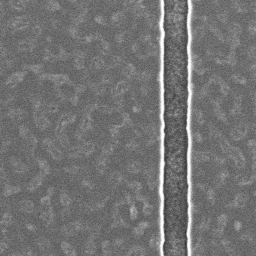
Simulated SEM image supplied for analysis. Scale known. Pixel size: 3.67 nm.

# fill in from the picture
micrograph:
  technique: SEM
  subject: one or a few lines or trenches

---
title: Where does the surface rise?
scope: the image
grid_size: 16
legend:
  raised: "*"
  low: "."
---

**********..****
**********..****
**********..****
**********..****
**********..****
**********..****
**********..****
**********..****
**********..****
**********..****
**********..****
**********..****
**********..****
**********..****
**********..****
**********..****